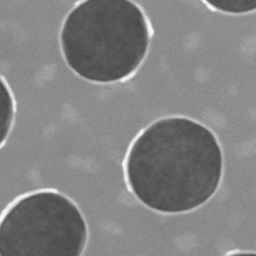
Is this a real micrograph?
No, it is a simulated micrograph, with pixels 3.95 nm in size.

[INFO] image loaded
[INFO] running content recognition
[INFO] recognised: holes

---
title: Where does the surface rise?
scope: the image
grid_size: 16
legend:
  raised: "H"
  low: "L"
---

HHHHHLLLLHHHHHLL
HHHHLLLLLHHHHHHH
HHHHLLLLLHHHHHHH
HHHHLLLLLHHHHHHH
HHHHHLLLHHHHHHHH
HHHHHHHHHHHHHHHH
LHHHHHHHHHHHHHHH
LHHHHHHHHHLLHHHH
HHHHHHHHHLLLLHHH
HHHHHHHHLLLLLLHH
HHHHHHHHLLLLLLHH
HHHHHHHHLLLLLLHH
HLLLHHHHHLLLLHHH
LLLLLHHHHHHHHHHH
LLLLLHHHHHHHHHHH
LLLLLHHHHHHHHHHH